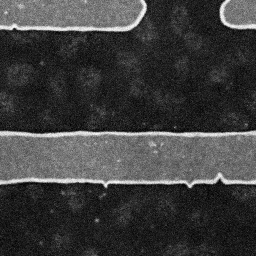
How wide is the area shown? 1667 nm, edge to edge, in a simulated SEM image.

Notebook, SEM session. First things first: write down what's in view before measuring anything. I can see one or a few lines or trenches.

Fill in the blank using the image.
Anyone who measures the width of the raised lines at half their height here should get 316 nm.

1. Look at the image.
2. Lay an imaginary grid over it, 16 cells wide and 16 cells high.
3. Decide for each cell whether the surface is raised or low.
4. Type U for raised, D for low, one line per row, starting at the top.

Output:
UUUUUUUUUDDDDDUU
UUUUUUUUDDDDDDUU
DDDDDDDDDDDDDDDD
DDDDDDDDDDDDDDDD
DDDDDDDDDDDDDDDD
DDDDDDDDDDDDDDDD
DDDDDDDDDDDDDDDD
DDDDDDDDDDDDDDDD
UUUUUUUUUUUUUUUU
UUUUUUUUUUUUUUUU
UUUUUUUUUUUUUUUU
DDDDDDDDDDDDDDDD
DDDDDDDDDDDDDDDD
DDDDDDDDDDDDDDDD
DDDDDDDDDDDDDDDD
DDDDDDDDDDDDDDDD